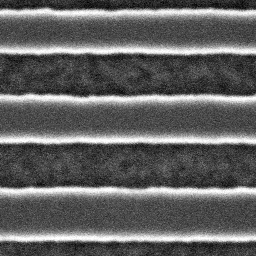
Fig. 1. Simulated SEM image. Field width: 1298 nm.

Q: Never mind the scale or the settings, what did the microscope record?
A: lines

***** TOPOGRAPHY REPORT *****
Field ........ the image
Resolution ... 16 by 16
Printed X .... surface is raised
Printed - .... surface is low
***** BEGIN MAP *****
----------------
XXXXXXXXXXXXXXXX
XXXXXXXXXXXXXXXX
----------------
----------------
----------------
XXXXXXXXXXXXXXXX
XXXXXXXXXXXXXXXX
XXXXXXXXXXXXXXXX
----------------
----------------
----------------
XXXXXXXXXXXXXXXX
XXXXXXXXXXXXXXXX
XXXXXXXXXXXXXXXX
----------------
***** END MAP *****